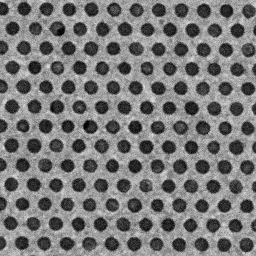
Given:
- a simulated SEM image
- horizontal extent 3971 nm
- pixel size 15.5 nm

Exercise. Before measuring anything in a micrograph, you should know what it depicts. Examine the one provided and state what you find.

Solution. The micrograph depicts a regular array of holes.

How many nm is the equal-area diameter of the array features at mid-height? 223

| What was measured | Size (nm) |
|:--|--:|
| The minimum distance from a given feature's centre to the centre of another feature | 345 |